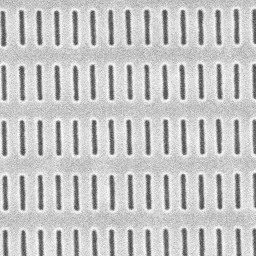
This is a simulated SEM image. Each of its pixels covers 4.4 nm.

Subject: a regular array of holes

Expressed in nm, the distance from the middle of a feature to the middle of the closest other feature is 77.8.